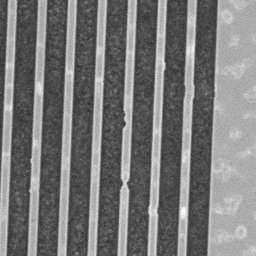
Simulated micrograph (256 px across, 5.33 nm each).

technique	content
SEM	parallel lines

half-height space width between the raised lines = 113 nanometres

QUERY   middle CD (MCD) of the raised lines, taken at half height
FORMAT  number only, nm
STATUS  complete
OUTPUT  46.6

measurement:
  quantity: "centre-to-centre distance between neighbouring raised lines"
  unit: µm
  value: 0.16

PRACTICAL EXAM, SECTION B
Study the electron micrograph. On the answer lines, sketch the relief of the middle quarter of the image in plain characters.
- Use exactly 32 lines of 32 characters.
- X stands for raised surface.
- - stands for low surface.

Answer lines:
XX------XX-----XX------XX-----XX
XX------XX-----XX------XX-----XX
XX------XX-----XX------XX-----XX
XX------XX-----XX------XX-----XX
XX------XX-----XX------XX-----XX
XX------XX-----XX------XX-----XX
XX------XX-----XX------XX-----XX
XX------XX-----XX------XX-----XX
XX------XX-----XX------XX-----XX
XX------XX-----XX------XX-----XX
XX------XX-----XX------XX-----XX
XX------X------XX------X------XX
XX-----XX------XX-----XX------XX
XX-----XX------XX-----XX------XX
XX-----XX------XX-----XX------XX
XX-----XX------XX-----XX------XX
XX-----XX------XX-----XX------XX
XX-----XX------XX-----XX------XX
XX-----XX------XX-----XX------XX
XX-----XX------XX-----XX------XX
XX-----XX------XX-----XX------XX
XX-----XX------XX-----XX------XX
XX-----XX------XX-----XX------XX
X------XX------X------XX------X-
X------XX-----XX------XX-----XX-
X------XX-----XX------XX-----XX-
X------XX-----XX------XX-----XX-
X------XX-----XX------XX-----XX-
X------XX-----XX------XX-----XX-
X------XX------X------XX-----XX-
X------XX------X------XX-----XX-
X------XX-----XX------XX-----XX-